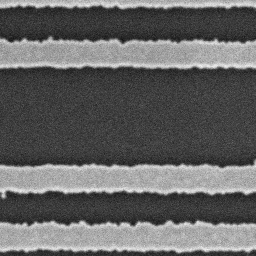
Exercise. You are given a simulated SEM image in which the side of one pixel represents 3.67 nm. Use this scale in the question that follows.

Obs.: lines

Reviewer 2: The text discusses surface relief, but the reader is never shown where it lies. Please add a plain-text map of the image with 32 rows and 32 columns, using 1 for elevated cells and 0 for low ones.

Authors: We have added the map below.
11111111111111111111111111111111
00000000000000000000000000000000
00000000000000000000000000000000
00000000000000000000000000000000
00000000000000000000000000000000
11111111111111111111111111111111
11111111111111111111111111111111
11111111111111111111111111111111
00000000000000000000000000000000
00000000000000000000000000000000
00000000000000000000000000000000
00000000000000000000000000000000
00000000000000000000000000000000
00000000000000000000000000000000
00000000000000000000000000000000
00000000000000000000000000000000
00000000000000000000000000000000
00000000000000000000000000000000
00000000000000000000000000000000
00000000000000000000000000000000
00000000000000000000000000000000
11111111111111111111111111111111
11111111111111111111111111111111
11111111111111111111111111111111
00000000000000000000000000000000
00000000000000000000000000000000
00000000000000000000000000000000
00000000000000000000000000000000
11111111111111111111111111111111
11111111111111111111111111111111
11111111111111111111111111111111
00000000000000000000001000000000